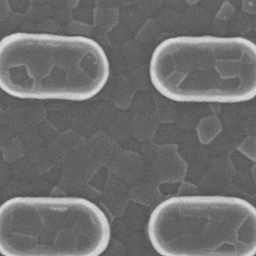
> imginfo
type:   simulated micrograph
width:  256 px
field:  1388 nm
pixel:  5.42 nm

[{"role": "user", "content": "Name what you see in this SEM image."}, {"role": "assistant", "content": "raised bodies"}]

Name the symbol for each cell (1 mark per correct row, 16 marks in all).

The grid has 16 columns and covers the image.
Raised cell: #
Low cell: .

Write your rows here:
................
................
.####......####.
######....######
#######...######
######....######
................
................
................
................
................
................
.##........###..
######....######
#######..#######
######....######